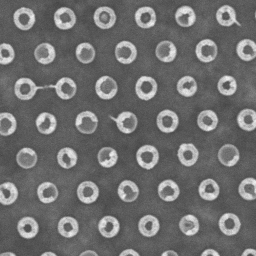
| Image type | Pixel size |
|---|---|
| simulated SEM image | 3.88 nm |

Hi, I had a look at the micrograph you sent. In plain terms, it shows a regular array of raised bodies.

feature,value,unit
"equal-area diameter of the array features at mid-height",0.0815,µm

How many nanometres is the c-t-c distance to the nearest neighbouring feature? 154